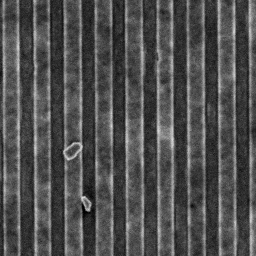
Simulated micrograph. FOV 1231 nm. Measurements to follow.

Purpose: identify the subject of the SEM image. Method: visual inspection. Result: parallel lines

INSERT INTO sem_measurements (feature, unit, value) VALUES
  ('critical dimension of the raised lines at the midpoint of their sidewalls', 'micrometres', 0.0812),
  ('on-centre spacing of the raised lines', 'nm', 148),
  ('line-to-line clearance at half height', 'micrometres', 0.0686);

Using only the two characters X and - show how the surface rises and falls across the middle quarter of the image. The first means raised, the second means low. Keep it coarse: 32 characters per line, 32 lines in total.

XXXX----XXXX----XXXX---XXXX----X
XXXX----XXXX----XXXX---XXXX----X
XXXX----XXXX----XXXX---XXXX----X
XXXX----XXXX----XXXX---XXXX----X
XXXX----XXXX----XXXX---XXXX----X
XXXX----XXXX----XXXX---XXXX----X
XXXX----XXXX----XXXX---XXXX----X
XXXX----XXXX----XXXX---XXXX----X
XXXX----XXXX----XXXX---XXXX----X
XXXX----XXXX----XXXX---XXXX----X
XXXX----XXXX----XXXX---XXXX----X
XXXX----XXXX----XXXX---XXXX----X
XXXX----XXXX---XXXXX---XXXX----X
XXXX----XXXX---XXXXX---XXXX----X
XXXX----XXXX----XXXX---XXXX----X
XXXX----XXXX----XXXX---XXXX----X
XXXX----XXXX---XXXXX---XXXX----X
XXXX----XXXX---XXXXX---XXXX----X
XXXX----XXXX----XXXX---XXXX----X
XXXX----XXXX---XXXXX---XXXX----X
XXXXX---XXXX---XXXXX---XXXX----X
XXXX----XXXX---XXXXX---XXXX----X
XXXX----XXXX---XXXXX---XXXX----X
XXXX----XXXX----XXXX---XXXX----X
XXXX----XXXX----XXXX---XXXX----X
XXXX----XXXX----XXXX----XXX----X
XXXX----XXXX----XXXX----XXX----X
XXXX----XXXX----XXXX----XXX----X
XXXX----XXXX----XXXX----XXX----X
XXXX----XXXX----XXXX----XXX----X
XXXX----XXXX----XXXX----XXX----X
XXXX----XXXX----XXXX----XXX----X